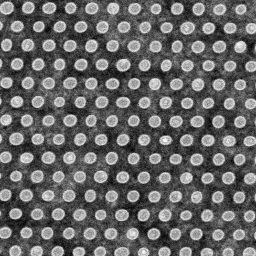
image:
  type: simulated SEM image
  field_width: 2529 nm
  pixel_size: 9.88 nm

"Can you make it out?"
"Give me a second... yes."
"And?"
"a regular array of raised bodies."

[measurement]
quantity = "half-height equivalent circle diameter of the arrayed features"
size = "11.7 pixels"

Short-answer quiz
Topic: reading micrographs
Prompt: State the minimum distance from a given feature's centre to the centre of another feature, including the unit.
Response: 207 nm